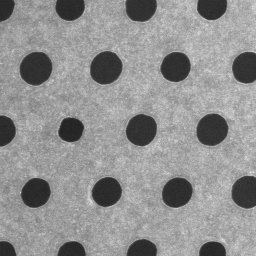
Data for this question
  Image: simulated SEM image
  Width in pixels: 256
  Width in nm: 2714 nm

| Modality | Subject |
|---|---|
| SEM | a regular array of holes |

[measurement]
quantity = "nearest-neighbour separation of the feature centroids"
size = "746 nm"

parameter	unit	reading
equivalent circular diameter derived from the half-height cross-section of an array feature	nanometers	329